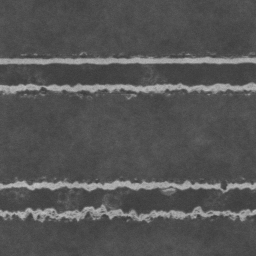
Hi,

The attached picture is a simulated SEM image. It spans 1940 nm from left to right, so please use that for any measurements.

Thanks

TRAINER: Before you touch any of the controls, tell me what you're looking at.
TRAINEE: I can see one or a few lines or trenches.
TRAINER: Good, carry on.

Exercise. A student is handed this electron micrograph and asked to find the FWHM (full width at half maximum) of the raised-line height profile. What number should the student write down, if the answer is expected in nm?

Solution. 208